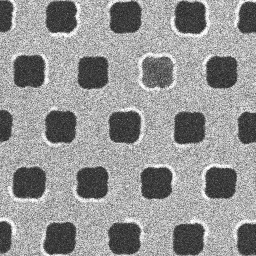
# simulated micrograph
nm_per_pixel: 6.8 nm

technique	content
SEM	a regular array of holes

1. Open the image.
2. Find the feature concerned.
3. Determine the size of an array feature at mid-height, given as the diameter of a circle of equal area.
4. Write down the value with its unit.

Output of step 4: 234 nm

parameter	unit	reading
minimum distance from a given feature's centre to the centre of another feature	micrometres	0.431